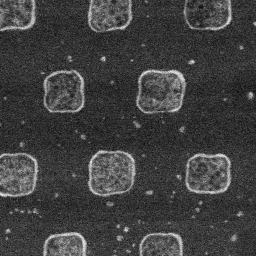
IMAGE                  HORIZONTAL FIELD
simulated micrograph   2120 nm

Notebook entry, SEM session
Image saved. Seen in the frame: raised bodies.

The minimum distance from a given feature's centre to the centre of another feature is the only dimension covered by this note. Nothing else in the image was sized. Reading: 0.777 microns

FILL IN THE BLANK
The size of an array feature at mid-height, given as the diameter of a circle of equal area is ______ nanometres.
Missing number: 368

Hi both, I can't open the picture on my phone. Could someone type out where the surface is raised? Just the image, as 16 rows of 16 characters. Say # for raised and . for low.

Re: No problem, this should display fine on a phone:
##....##....##..
##....##....##..
................
................
.........#......
...##....##.....
...##....##.....
................
................
................
##....##....##..
##....##....##..
................
................
................
...##....##.....